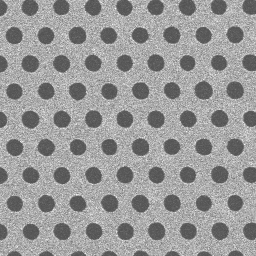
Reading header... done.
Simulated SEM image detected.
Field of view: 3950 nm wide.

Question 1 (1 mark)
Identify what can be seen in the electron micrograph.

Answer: a regular array of holes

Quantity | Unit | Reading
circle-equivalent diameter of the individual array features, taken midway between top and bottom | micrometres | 0.265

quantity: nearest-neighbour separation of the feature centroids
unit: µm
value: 0.485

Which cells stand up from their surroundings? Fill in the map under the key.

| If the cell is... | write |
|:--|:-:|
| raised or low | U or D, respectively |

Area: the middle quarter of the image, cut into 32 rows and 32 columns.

DDUUUDDDDUUUUDDDDUUUUDDDDUUUUDDD
DUUUUUDDDUUUUUDDUUUUUUDDUUUUUUDD
UUUUUUUUUUUUUUUUUUUUUUUUUUUUUUUU
UUUUUUUUUUUUUUUUUUUUUUUUUUUUUUUU
UUUUUUUUUUUUUUUUUUUDUUUUUUUUUUUU
UUDDDUUUUUDDDUUUUDDDDUUUUDDDDUUU
UDDDDDUUUDDDDDUUUDDDDUUUUDDDDUUU
UDDDDUUUUDDDDUUUUDDDDUUUUDDDDUUU
UUDDDUUUUUDDDUUUUUDDDUUUUUDDUUUU
UUUUUUUUUUUUUUUUUUUUUUUUUUUUUUUU
UUUUUUUUUUUUUUUUUUUUUUUUUUUUUUUU
UUUUUUUDUUUUUUUUUUUUUUUUUUUUUUUU
DUUUUUDDDUUUUDDDDUUUUDDDDUUUUDDD
DDUUUDDDDDUUUDDDDUUUUDDDDUUUUDDD
DDUUUDDDDUUUUDDDDUUUUDDDDUUUUDDD
DUUUUUDDDUUUUUDDDUUUUUDDDUUUUUDD
UUUUUUUUUUUUUUUUUUUUUUUUUUUUUUUU
UUUUUUUUUUUUUUUUUUUUUUUUUUUUUUUU
UUUUUUUUUUUUUUUUUUUUUUUUUUUUUUUU
UUDDDUUUUUDDDUUUUDDDDUUUUDDDDUUU
UDDDDDUUUDDDDUUUUDDDDUUUUDDDDUUU
UUDDDUUUUUDDDUUUUDDDDUUUUDDDDUUU
UUDDDUUUUUDDDUUUUUDDDUUUUUDDUUUU
UUUUUUUUUUUUUUUUUUUUUUUUUUUUUUUU
UUUUUUUUUUUUUUUUUUUUUUUUUUUUUUUU
UUUUUUUUUUUUUUUUUUUUUUUUUUUUUUUU
DUUUUUDDDUUUUDDDDUUUUDDDDUUUUDDD
DDUUUDDDDUUUUDDDDUUUUDDDDUUUUDDD
DDUUUUDDDUUUUDDDDUUUUDDDDUUUUDDD
DUUUUUDDDUUUUUDDDUUUUUDDUUUUUUDD
UUUUUUUUUUUUUUUUUUUUUUUUUUUUUUUU
UUUUUUUUUUUUUUUUUUUUUUUUUUUUUUUU